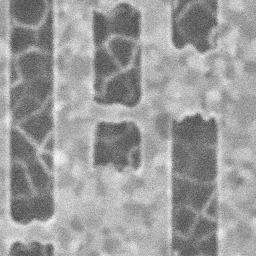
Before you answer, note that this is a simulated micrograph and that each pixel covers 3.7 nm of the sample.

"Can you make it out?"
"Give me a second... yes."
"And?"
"one or a few lines or trenches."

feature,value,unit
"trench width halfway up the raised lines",0.178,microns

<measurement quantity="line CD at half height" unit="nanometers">138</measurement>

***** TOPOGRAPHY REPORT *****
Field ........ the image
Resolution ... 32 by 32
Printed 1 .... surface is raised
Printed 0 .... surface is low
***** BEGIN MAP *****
10111001111111101111100000011111
10110001111100000011100000011111
10000001111100000011100000011111
10000001111100000011100000011111
10000001111100000011100000011111
10000001111100000011100000011111
10000001111100000011111110111111
10000001111100000011111111111111
10000001111100000011111111111111
10000001111100000011111111111111
10000001111100000011111111111111
10000001111100000011111111111111
10000001111100000011111111111111
10000001111111111111111111111111
10000001111111111111111001111111
10000001111100000111100000011111
10000001111100000011100000011111
10000001111000000011100000011111
10000001111100000011100000011111
10000001111100000011100000011111
10000001111100000011100000011111
10000001111111111111100000011111
10000001111111111111100000011111
10000001111111111111100000011111
10000001111111111111100000011111
10000001111111111111100000011111
10000001111111111111100000011111
11000011111111111111100000011111
11111111111111111111100000011111
11111111111111111111100000011111
11000001111111111111100000011111
10110001111111111111100000011111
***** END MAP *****